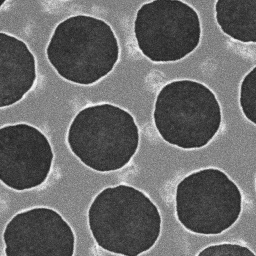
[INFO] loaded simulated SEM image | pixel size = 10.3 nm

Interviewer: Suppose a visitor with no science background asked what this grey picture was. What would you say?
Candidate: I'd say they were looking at holes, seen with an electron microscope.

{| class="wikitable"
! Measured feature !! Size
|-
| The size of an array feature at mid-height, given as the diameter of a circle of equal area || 705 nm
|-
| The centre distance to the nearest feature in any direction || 911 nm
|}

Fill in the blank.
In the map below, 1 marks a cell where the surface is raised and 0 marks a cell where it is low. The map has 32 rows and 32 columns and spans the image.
11111111111111111100000111100000
11111111111111111000000011100000
11111111000001111000000001100000
11111110000000111000000001110000
01111110000000111000000001111000
00011100000000011000000001111111
00001100000000011100000011111111
00001100000000011110001111111111
00001110000000111111111111111111
00001111000001111111111111111110
00001111110111111111100001111100
00011111111111111111000000111100
00111111111111111111000000011100
11111111111000011110000000011100
11111111110000001110000000001110
11111111100000000110000000011111
00000111100000000111000000011111
00000011000000000111100000111111
00000011100000000111111011111111
00000001110000000111111111111111
00000011111000001111111111111111
00000011111111111111111110001111
00000011111111111111111000000111
10001111111110000111110000000011
11111111111100000011110000000011
11111111111000000001110000000011
11100001111000000000110000000011
10000000111000000000110000000011
10000000011000000000111000001111
00000000011100000000111111111111
10000000011100000001111111110111
10000000011111000011111110000001